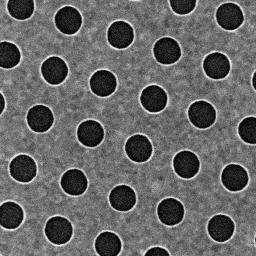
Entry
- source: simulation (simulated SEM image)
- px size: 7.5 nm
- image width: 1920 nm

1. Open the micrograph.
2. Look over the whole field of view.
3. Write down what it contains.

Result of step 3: a regular array of holes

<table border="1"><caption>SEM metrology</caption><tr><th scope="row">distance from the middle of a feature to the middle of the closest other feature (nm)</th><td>377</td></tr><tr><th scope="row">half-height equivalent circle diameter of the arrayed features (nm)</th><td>211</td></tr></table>